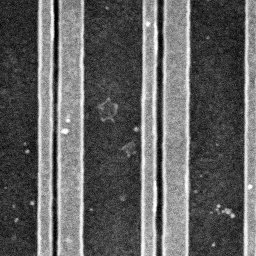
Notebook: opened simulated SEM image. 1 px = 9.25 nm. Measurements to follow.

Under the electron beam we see lines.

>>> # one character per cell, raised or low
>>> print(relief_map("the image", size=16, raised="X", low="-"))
---XX----XXX---X
---XX----XXX---X
---XX----XXX---X
--XXX----XXX---X
--XXX----XXX---X
--XXX----XXX---X
--XXX----XXX---X
--XXX----XXX---X
--XXX----XXX---X
--XXX----XXX---X
--XXX----XXX---X
--XXX----XXX---X
--XXX----XXX---X
--XXX----XXX---X
--XXX----XXX---X
--XXX----XXX---X